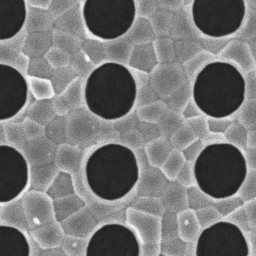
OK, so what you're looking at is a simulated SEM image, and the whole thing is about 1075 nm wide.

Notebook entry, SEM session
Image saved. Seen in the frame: holes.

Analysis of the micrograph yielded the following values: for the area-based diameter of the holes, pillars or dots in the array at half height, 226 nm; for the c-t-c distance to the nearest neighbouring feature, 0.338 microns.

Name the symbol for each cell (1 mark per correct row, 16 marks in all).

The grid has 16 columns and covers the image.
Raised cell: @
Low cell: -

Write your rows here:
--@@@---@@@@---@
-@@@@---@@@@---@
@@@@@@@@@@@@@@@@
@@@@@@@@@@@@@@@@
-@@@@@--@@@@@--@
--@@@---@@@@---@
-@@@@---@@@@---@
@@@@@@@@@@@@@@@@
@@@@@@@@@@@@@@@@
-@@@@@--@@@@@--@
--@@@----@@@---@
--@@@@--@@@@---@
-@@@@@@@@@@@@@@@
@@@@@@@@@@@@@@@@
-@@@@@--@@@@@--@
--@@@----@@@---@